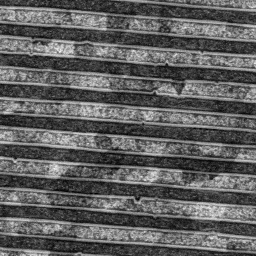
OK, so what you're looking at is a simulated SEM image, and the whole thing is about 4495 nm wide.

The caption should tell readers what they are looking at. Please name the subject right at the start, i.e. parallel lines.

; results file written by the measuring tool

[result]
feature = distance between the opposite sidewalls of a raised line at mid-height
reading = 278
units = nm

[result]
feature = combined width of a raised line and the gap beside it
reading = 530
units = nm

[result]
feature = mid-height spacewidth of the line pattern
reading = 260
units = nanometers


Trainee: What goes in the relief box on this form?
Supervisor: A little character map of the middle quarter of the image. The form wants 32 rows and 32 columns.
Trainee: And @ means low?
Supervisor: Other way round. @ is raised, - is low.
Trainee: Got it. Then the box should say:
--------------------------------
--------------------------------
@@@@@@@-------------------------
@@@@@@@@@@@@@@@@@@--------------
@@@@@@@@@@@@@@@@@@@@@@@@@@@@-@@@
@@@@@@@@@@@@@@@@@@@@@@@@@@@@@@@@
----------@@@@@@@@@@@@@@@@@@@@@@
-------------------------@@@@@@@
--------------------------------
--------------------------------
@@@@@@@@@@@@@@------------------
@@@@@@@@@@@@@@@@@@@@@@@@@@@-----
@@@@@@@@@@@@@@@@@@@@@@@@@@@@@@@@
---@@@@@@@@@@@@@@@@@@@@@@@@@@@@@
-----------------@@@@@@@@@@@@@@@
--------------------------------
--------------------------------
@@@@@@@-------------------------
@@@@@@@@@@@@@@@@@@@@------------
@@@@@@@@@@@@@@@@@@@@@@@@@@@@@@@-
@@@@@@@@@@@@@@@@@@@@@@@@@@@@@@@@
-------@@@@@@@@@@@@@@@@@@@@@@@@@
--------------------@@@@@@@@@@@@
--------------------------------
--------------------------------
@@@@@@@@@@@--@------------------
@@@@@@@@@@@@@@@@@@@@@@@@@@@-----
@@@@@@@@@@@@@@@@@@@@@@@@@@@@@@@@
@@@@@@@@@@@@@@@@@@@@@@@@@@@@@@@@
-----------------@@@@@@@@@@@@@@@
---------------------------@@@@@
--------------------------------